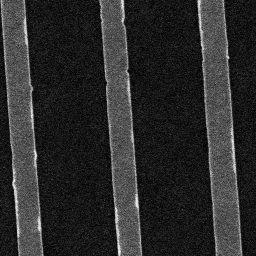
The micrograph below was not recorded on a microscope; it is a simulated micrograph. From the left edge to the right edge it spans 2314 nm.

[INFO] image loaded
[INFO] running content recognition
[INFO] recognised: one or a few lines or trenches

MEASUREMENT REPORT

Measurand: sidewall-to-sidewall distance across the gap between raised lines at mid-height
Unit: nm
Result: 674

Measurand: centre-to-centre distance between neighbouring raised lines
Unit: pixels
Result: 98.8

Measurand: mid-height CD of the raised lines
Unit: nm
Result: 219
